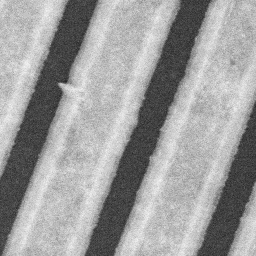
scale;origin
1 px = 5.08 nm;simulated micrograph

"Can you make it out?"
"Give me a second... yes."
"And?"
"one or a few lines or trenches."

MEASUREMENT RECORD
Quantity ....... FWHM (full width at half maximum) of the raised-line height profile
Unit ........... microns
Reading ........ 0.279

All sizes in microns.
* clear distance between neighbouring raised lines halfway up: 0.256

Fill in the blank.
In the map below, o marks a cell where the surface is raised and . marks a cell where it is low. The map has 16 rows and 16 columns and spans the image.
ooo....ooo....oo
ooo...oooo...ooo
ooo...oooo...ooo
oo....ooo....ooo
oo...oooo...oooo
o....oooo...oooo
o...oooo....ooo.
o...oooo...oooo.
....ooo....ooo..
...oooo...oooo..
...oooo...oooo..
..oooo....ooo...
..oooo...oooo...
..ooo....oooo...
.oooo...oooo....
.oooo...oooo...o